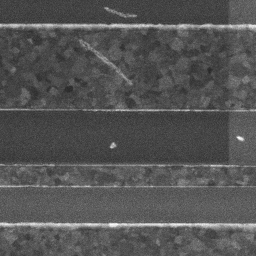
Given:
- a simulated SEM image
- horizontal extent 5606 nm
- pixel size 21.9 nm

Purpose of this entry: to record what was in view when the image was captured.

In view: lines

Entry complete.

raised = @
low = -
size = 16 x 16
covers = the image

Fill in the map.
----------------
----------------
@@@@@@@@@@@@@@@@
@@@@@@@@@@@@@@@@
@@@@@@@@@@@@@@@@
@@@@@@@@@@@@@@@@
@@@@@@@@@@@@@@@@
----------------
----------------
----------------
@@@@@@@@@@@@@@@@
@@@@@@@@@@@@@@@@
----------------
----------------
@@@@@@@@@@@@@@@@
@@@@@@@@@@@@@@@@